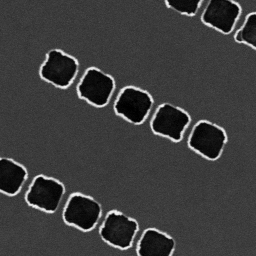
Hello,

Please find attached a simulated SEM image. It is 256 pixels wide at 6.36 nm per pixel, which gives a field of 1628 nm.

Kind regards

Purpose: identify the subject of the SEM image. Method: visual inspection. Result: a regular array of holes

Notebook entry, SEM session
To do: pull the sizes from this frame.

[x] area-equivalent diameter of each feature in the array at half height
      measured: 207 nanometres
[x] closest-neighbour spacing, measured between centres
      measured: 0.261 micrometres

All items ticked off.